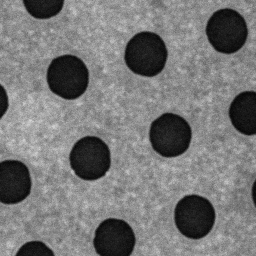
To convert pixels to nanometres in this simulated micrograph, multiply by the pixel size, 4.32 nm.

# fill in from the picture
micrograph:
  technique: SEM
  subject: holes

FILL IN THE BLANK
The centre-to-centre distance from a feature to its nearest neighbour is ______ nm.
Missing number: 360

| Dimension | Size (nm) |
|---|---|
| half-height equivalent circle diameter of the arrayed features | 193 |